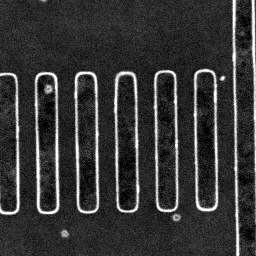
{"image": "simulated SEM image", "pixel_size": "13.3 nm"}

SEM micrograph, groups of lines, slits or small figures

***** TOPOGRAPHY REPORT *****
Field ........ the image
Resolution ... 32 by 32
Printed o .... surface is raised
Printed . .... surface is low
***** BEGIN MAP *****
.............................ooo
.............................ooo
.............................ooo
.............................ooo
.............................ooo
.............................ooo
.............................ooo
.............................ooo
.............................ooo
oo...oo...oo...oo...oo..ooo..ooo
oo...oo...oo...oo..ooo..ooo..ooo
oo...oo...oo..ooo..ooo..ooo..ooo
oo...oo...oo..ooo..ooo..ooo..ooo
oo...oo...oo..ooo..ooo..ooo..ooo
oo...oo...oo..ooo..ooo..ooo..ooo
oo...oo...oo..ooo..ooo..ooo..ooo
oo...oo...oo...oo...oo..ooo..ooo
oo...oo...oo...oo...oo..ooo...oo
oo...oo...oo...oo...oo...oo...oo
oo...oo...oo...oo...oo...oo...oo
oo...oo...oo...oo...oo...oo...oo
oo...oo...oo...oo...oo...oo...oo
oo...oo...oo...oo...oo...oo...oo
oo...oo...oo...oo...oo...oo...oo
oo...oo...oo...oo...oo...oo...oo
oo...oo...oo...oo...oo...oo...oo
oo...oo...oo..................oo
..............................oo
..............................oo
..............................oo
..............................oo
..............................oo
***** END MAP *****